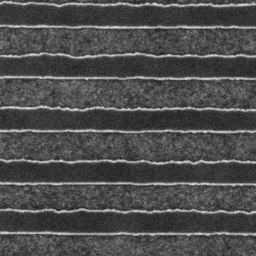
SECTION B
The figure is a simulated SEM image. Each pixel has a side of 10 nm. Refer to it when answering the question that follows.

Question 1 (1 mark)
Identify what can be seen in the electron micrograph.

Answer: lines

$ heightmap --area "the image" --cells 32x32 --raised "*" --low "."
*******.****..**..**...........*
********************************
********************************
................................
................................
................................
................................
********************************
********************************
********************************
................................
................................
................................
***.**......*..........*........
********************************
********************************
...............***....**********
................................
................................
................................
********************************
********************************
********************************
................................
................................
................................
********************************
********************************
********************************
................................
................................
................................